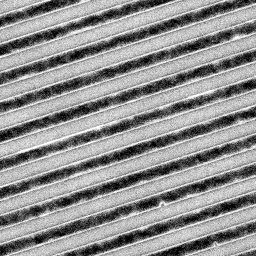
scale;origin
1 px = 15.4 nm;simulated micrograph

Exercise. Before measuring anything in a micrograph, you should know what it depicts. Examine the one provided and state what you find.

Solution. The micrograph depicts parallel lines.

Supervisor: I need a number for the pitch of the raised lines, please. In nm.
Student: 420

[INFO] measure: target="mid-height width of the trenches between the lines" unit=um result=0.211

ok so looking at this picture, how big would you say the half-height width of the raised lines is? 13.7 px